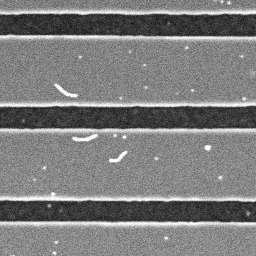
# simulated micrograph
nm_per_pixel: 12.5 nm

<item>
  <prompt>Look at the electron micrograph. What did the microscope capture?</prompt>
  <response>lines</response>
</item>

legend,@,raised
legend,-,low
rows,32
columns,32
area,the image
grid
@@@@@@@@@@@@@@@@@@@@@@@@@@@@@@@@
@@@@@@@@@@@@@@@@@@@@@@@@@@@@@@@@
--------------------------------
--------------------------------
--------------------------------
@@@@@@@@@@@@@@@@@@@@@@@@@@@@@@@@
@@@@@@@@@@@@@@@@@@@@@@@@@@@@@@@@
@@@@@@@@@@@@@@@@@@@@@@@@@@@@@@@@
@@@@@@@@@@@@@@@@@@@@@@@@@@@@@@@@
@@@@@@@@@@@@@@@@@@@@@@@@@@@@@@@@
@@@@@@@@@@@@@@@@@@@@@@@@@@@@@@@@
@@@@@@@@@@@@@@@@@@@@@@@@@@@@@@@@
@@@@@@@@@@@@@@@@@@@@@@@@@@@@@@@@
--------------------------------
--------------------------------
--------------------------------
@@@@@@@@@@@@@@@@@@@@@@@@@@@@@@@@
@@@@@@@@@@@@@@@@@@@@@@@@@@@@@@@@
@@@@@@@@@@@@@@@@@@@@@@@@@@@@@@@@
@@@@@@@@@@@@@@@@@@@@@@@@@@@@@@@@
@@@@@@@@@@@@@@@@@@@@@@@@@@@@@@@@
@@@@@@@@@@@@@@@@@@@@@@@@@@@@@@@@
@@@@@@@@@@@@@@@@@@@@@@@@@@@@@@@@
@@@@@@@@@@@@@@@@@@@@@@@@@@@@@@@@
@@@@@@@@@@@@@@@@@@@@@@@@@@@@@@@@
--------------------------------
--------------------------------
--------------------------------
@@@@@@@@@@@@@@@@@@@@@@@@@@@@@@@@
@@@@@@@@@@@@@@@@@@@@@@@@@@@@@@@@
@@@@@@@@@@@@@@@@@@@@@@@@@@@@@@@@
@@@@@@@@@@@@@@@@@@@@@@@@@@@@@@@@